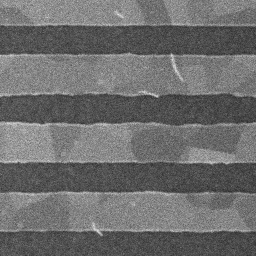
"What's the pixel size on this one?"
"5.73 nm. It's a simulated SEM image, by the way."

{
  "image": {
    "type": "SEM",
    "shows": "one or a few lines or trenches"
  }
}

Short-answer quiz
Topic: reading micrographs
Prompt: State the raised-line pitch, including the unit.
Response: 392 nm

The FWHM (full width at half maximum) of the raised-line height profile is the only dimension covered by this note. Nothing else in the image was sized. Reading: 0.217 um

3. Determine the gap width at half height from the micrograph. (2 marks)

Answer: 172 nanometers